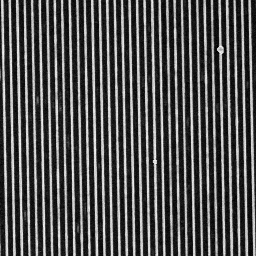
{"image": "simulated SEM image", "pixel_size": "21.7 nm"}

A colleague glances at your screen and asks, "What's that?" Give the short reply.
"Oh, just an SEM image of parallel lines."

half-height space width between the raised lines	5.5	pixels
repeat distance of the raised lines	163	nanometres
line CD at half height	0.0407	microns